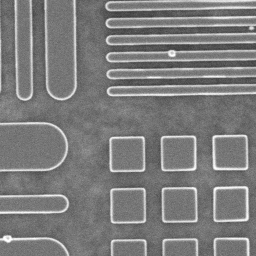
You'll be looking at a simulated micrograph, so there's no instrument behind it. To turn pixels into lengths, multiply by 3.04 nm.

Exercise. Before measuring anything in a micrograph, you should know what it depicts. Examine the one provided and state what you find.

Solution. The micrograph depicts groups of lines, slits or small figures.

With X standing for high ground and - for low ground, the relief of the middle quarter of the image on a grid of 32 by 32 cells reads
XXX-----------------------------
XXX---------XXXXXXXXXXXXXXXXXXXX
XXX--------XXXXXXXXXXXXXXXXXXXXX
XXX--------XXXXXX---------------
XXX-----------------------------
XXX-----------------------------
XXX--------XXXXXXXXXXXXXXXXXXXXX
XX---------XXXXXXXXXXXXXXXXXXXXX
X-------------------------------
--------------------------------
--------------------------------
--------------------------------
--------------------------------
--------------------------------
--------------------------------
--------------------------------
--------------------------------
--------------------------------
------------XXXXXXXX----XXXXXXXX
X-----------XXXXXXXX----XXXXXXXX
X-----------XXXXXXXX----XXXXXXXX
X-----------XXXXXXXX----XXXXXXXX
------------XXXXXXXX----XXXXXXXX
------------XXXXXXXX----XXXXXXXX
------------XXXXXXXX----XXXXXXXX
------------XXXXXXXX----XXXXXXXX
------------XXXXXXXX-----XXXXXXX
--------------------------------
--------------------------------
--------------------------------
--------------------------------
------------XXXXXXXX-----XXXXXXX